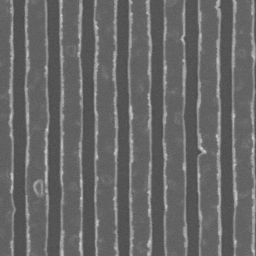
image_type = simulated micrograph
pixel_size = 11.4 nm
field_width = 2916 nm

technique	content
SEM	parallel lines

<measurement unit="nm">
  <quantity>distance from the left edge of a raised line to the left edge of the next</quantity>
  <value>393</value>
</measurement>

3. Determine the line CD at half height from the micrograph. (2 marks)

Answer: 239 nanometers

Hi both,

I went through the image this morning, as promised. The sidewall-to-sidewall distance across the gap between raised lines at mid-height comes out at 0.148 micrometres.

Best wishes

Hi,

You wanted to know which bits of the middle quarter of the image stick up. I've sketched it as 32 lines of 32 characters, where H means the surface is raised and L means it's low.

HHHHLLLLHHHHHLLLHHHHHHLLLHHHHHLL
HHHHLLLLHHHHHLLLHHHHHHLLLHHHHHLL
HHHHLLLLHHHHHLLLHHHHHHLLLHHHHHLL
HHHHLLLLHHHHHLLLHHHHHHLLLHHHHHLL
HHHHLLLLHHHHHLLLHHHHHHLLLHHHHHLL
HHHHLLLLHHHHHLLLHHHHHHLLLHHHHHLL
HHHHLLLLHHHHHLLLHHHHHHLLLHHHHHLL
HHHHHLLLHHHHHLLLLHHHHLLLLHHHHHLL
HHHHHLLLHHHHHLLLLHHHHLLLLHHHHHLL
HHHHHLLLHHHHHLLLLHHHHHLLLHHHHHLL
HHHHHLLLHHHHHLLLLHHHHHLLLHHHHHLL
HHHHHLLLHHHHHLLLLHHHHHLLLHHHHHLL
HHHHHLLLHHHHHLLLLHHHHHLLLHHHHHLL
HHHHHLLLHHHHHLLLLHHHHHLLLHHHHHLL
HHHHHLLLHHHHHLLLLHHHHHLLLHHHHHLL
HHHHHLLLHHHHHLLLLHHHHHLLLHHHHHLL
HHHHHLLLHHHHHLLLLHHHHHLLLHHHHHLL
HHHHLLLLHHHHHLLLLHHHHHLLLHHHHHLL
HHHHLLLLHHHHHLLLLHHHHHLLLHHHHHLL
HHHHLLLLHHHHHLLLLHHHHHLLLHHHHHLL
HHHHLLLLHHHHHLLLLHHHHHLLLHHHHHLL
HHHHLLLLHHHHHLLLLHHHHHLLLHHHHHLL
HHHHLLLLHHHHHLLLLHHHHHLLLHHHHHLL
HHHHLLLLHHHHHLLLLHHHHHLLLHHHHHLL
HHHHLLLLHHHHHLLLLHHHHHLLLHHHHHLL
HHHHLLLLHHHHHLLLHHHHHHLLLHHHHHLL
HHHHLLLLHHHHHLLLLHHHHHLLLHHHHHLL
HHHHLLLLHHHHHLLLLHHHHHLLLHHHHHLL
HHHHLLLLHHHHHLLLLHHHHHLLLHHHHHLL
HHHHLLLLHHHHHLLLLHHHHLLLLHHHHHLL
HHHHLLLLHHHHHLLLLHHHHHLLLHHHHHLL
HHHHHLLLHHHHHLLLHHHHHLLLLHHHHHLL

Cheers